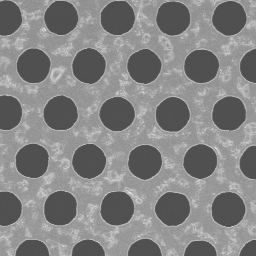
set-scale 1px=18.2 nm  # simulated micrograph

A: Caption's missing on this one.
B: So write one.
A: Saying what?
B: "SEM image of a regular array of holes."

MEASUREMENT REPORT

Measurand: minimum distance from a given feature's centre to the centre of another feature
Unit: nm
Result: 1000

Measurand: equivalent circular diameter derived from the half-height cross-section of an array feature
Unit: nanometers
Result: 624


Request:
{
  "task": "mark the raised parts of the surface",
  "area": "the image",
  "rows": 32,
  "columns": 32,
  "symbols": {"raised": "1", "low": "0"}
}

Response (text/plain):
00111100011111001111000111110011
00011100001110000111000011100001
00011100001110000111000011100001
00111100011110001111000111100011
01111111111111111111111111110111
11111111111111111111111111111111
11100111110011111001111100111110
11000011100001110000111000011100
11000011100001110000111000011100
11000011100001110000111000011100
11111111111111111111111111111111
11111111111111111111111111111111
00111100011110001111100111100011
00011100001110000111000011100001
00011100001100000110000011000001
00111100011110001111000111100011
11111111111111111111101111111111
11111111111111111111111111111111
11100111110011111001111100111110
11000011100001110000111000011100
11000011100001110000111000011100
11000011110001110000111000011100
11111111111111111111111111111111
11111111111111111111111111111111
00111100011110001111000111100011
00011100001110000111000011100011
00011100001110000110000011000001
00111100011110001111000111100011
11111111111111111111111111111111
11111111111111111111111111111111
11100011110011111000111100111110
11000011100001110000111000011100